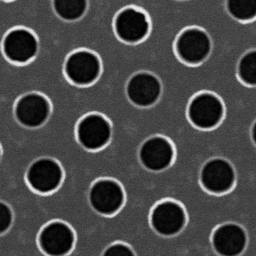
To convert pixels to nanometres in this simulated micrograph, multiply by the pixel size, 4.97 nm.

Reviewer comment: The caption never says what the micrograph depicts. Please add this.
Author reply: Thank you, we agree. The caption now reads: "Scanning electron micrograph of a regular array of holes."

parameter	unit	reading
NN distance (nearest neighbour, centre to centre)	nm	324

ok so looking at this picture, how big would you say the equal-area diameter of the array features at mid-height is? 164 nm